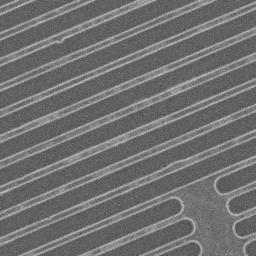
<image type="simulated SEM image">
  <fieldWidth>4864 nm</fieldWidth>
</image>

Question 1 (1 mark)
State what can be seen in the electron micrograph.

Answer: parallel lines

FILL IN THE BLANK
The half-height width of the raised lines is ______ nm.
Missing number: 114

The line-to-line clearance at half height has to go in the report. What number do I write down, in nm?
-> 339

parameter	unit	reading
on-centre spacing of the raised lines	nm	449